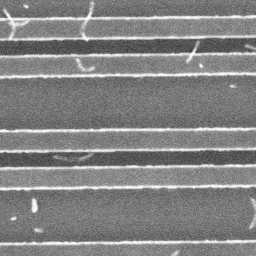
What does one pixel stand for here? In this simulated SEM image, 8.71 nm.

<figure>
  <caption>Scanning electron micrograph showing lines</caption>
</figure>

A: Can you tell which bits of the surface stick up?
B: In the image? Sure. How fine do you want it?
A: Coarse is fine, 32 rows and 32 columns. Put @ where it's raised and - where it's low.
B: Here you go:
--------------------------------
--------------------------------
@@@@@@@@@@@@@@@@@@@@@@@@@@@@@@@@
@@@@@@@@@@@@@@@@@@@@@@@@@@@@@@@@
@@@@@@@@@@@@@@@@@@@@@@@@@@@@@@@@
--------------------------------
--------------------------------
@@@@@@@@@@@@@@@@@@@@@@@@@@@@@@@@
@@@@@@@@@@@@@@@@@@@@@@@@@@@@@@@@
@@@@@@@@@@@@@@--@@--------------
--------------------------------
--------------------------------
--------------------------------
--------------------------------
--------------------------------
--------------------------------
@@@@@@@@@@@@@@@@@@@@@@@@@@@@@@@@
@@@@@@@@@@@@@@@@@@@@@@@@@@@@@@@@
@@@@@@@@@@@@@@@@@@@@@@@@@@@@@@@@
--------------------------------
--------------------------------
@@@@@@@@@@@@@@@@@@@@@@@@@@@@@@@@
@@@@@@@@@@@@@@@@@@@@@@@@@@@@@@@@
@@@@@@@@@@@@@@------------------
--------------------------------
--------------------------------
--------------------------------
--------------------------------
--------------------------------
--------------------------------
@@@@@@@@@@@@@@@@@@@@@@@@@@@@@@@@
@@@@@@@@@@@@@@@@@@@@@@@@@@@@@@@@